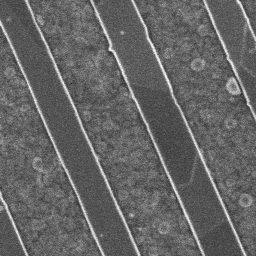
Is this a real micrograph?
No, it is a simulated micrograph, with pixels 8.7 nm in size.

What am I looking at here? one or a few lines or trenches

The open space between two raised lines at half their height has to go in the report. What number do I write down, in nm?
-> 517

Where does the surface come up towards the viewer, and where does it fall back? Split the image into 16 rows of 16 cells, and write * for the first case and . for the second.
**....***....**.
**....***....***
.**....**.....**
.**....***....**
.***....**.....*
..**....***...**
..***....**.....
...**....***....
...**....***....
....**....**....
....**....***...
....***....**...
.....**....***..
*....***....**..
*.....**....***.
**....***...***.